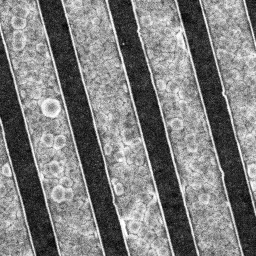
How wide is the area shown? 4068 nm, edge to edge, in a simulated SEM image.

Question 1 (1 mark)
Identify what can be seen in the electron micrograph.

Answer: one or a few lines or trenches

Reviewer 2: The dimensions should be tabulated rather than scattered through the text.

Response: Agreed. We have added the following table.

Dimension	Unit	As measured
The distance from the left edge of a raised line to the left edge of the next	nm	1050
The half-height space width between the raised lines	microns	0.674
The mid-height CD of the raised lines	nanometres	382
